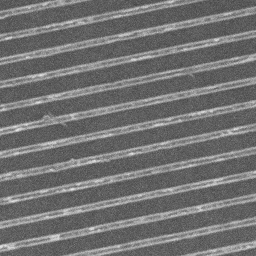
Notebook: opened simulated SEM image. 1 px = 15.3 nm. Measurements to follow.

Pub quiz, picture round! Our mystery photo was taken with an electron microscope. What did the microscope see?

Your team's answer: parallel lines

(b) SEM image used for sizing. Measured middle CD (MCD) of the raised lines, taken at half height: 0.0786 µm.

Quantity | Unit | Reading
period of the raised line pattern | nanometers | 350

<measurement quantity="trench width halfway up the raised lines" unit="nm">264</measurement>